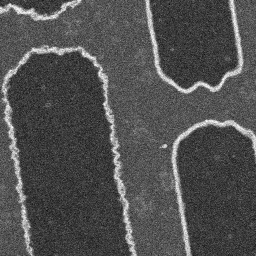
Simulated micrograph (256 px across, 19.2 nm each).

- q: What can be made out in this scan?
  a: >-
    one or a few lines or trenches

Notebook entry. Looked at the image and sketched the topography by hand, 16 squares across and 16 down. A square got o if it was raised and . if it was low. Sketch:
oooo.....oooooo.
.........oooooo.
..........ooooo.
..oooo....ooooo.
.ooooo....ooooo.
ooooooo....o....
ooooooo.........
ooooooo.........
.oooooo....ooooo
.oooooo....ooooo
.oooooo....ooooo
.oooooo....ooooo
.ooooooo...ooooo
.ooooooo...ooooo
..oooooo....oooo
..oooooo....oooo